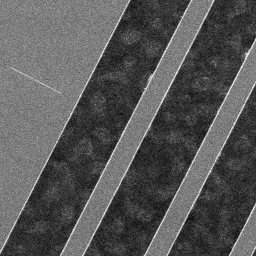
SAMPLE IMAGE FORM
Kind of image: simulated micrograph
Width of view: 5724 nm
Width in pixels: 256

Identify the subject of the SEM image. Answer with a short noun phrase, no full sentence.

one or a few lines or trenches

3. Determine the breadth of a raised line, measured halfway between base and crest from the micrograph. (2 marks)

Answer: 1230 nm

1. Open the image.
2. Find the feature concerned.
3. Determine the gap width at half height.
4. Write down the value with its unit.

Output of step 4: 445 nanometers